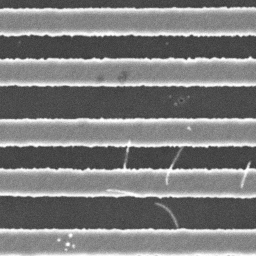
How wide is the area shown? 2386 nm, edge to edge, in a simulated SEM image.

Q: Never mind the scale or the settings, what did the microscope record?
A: lines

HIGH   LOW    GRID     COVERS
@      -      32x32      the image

--------------------------------
@@@@@@@@@@@@@@@@@@@@@@@@@@@@@@@@
@@@@@@@@@@@@@@@@@@@@@@@@@@@@@@@@
@@@@@@@@@@@@@@@@@@@@@@@@@@@@@@@@
--------------------------------
--------------------------------
--------------------------------
@@@@@@@@@@@@@@@@@@@@@@@@@@@@@@@@
@@@@@@@@@@@@@@@@@@@@@@@@@@@@@@@@
@@@@@@@@@@@@@@@@@@@@@@@@@@@@@@@@
@@@@@@@@@@@@@@@@@@@@@@@@@@@@@@@@
--------------------------------
--------------------------------
--------------------------------
--------------------------------
@@@@@@@@@@@@@@@@@@@@@@@@@@@@@@@@
@@@@@@@@@@@@@@@@@@@@@@@@@@@@@@@@
@@@@@@@@@@@@@@@@@@@@@@@@@@@@@@@@
--------------------------------
--------------------------------
--------------------------------
@@@@@@@@@@@@@@@@@@@@@@@@@@@@@@@@
@@@@@@@@@@@@@@@@@@@@@@@@@@@@@@@@
@@@@@@@@@@@@@@@@@@@@@@@@@@@@@@@@
-@@@@@@@@@@@@@@@@@@@@@@@@@@@@@@@
--------------------------------
--------------------------------
--------------------------------
--------------------------------
@@@@@@@@@@@@@@@@@@@@@@@@@@@@@@@@
@@@@@@@@@@@@@@@@@@@@@@@@@@@@@@@@
@@@@@@@@@@@@@@@@@@@@@@@@@@@@@@@@